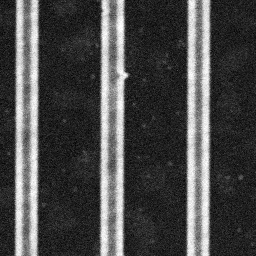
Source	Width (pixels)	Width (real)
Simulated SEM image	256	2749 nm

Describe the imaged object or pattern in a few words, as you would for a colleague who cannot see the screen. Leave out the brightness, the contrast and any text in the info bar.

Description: one or a few lines or trenches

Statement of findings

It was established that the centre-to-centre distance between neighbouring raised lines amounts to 923 nm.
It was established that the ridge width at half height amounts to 179 nanometres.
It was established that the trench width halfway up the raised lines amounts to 738 nanometres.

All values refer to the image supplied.